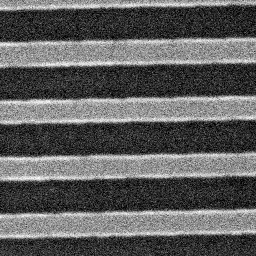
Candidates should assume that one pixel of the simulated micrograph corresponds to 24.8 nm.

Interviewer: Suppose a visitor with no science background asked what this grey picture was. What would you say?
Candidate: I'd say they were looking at lines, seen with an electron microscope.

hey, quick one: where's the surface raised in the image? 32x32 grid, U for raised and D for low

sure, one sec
UUUUUUUUUUUUUUUUUUUUUUUUUUUUUDDD
DDDDDDDDDDDDDDDDDDDDDDDDDDDDDDDD
DDDDDDDDDDDDDDDDDDDDDDDDDDDDDDDD
DDDDDDDDDDDDDDDDDDDDDDDDDDDDDDDD
DDDDDDDDDDDDDDDDDDDDDDDDDDDDDDDD
UUUUUUUUUUUUUUUUUUUUUUUUUUUUUUUU
UUUUUUUUUUUUUUUUUUUUUUUUUUUUUUUU
UUUUUUUUUUUUUUUUUUUUUUUUUUUUUUUU
DDDDDDDDDDDDDDDDDDDDDDDDDDDDDDDD
DDDDDDDDDDDDDDDDDDDDDDDDDDDDDDDD
DDDDDDDDDDDDDDDDDDDDDDDDDDDDDDDD
DDDDDDDDDDDDDDDDDDDDDDDDDDDDDDDD
DDDDDDDDDDDDDDDUUUUUUUUUUUUUUUUU
UUUUUUUUUUUUUUUUUUUUUUUUUUUUUUUU
UUUUUUUUUUUUUUUUUUUUUUUUUUUUUUUU
DDDDDDDDDDDDDDDDDDDDDDDDDDDDDDDD
DDDDDDDDDDDDDDDDDDDDDDDDDDDDDDDD
DDDDDDDDDDDDDDDDDDDDDDDDDDDDDDDD
DDDDDDDDDDDDDDDDDDDDDDDDDDDDDDDD
DDDDDDDDDDDDDDDDDDUUUUUUUUUUUUUU
UUUUUUUUUUUUUUUUUUUUUUUUUUUUUUUU
UUUUUUUUUUUUUUUUUUUUUUUUUUUUUUUU
DDDDDDDDDDDDDDDDDDDDDDDDDDDDDDDD
DDDDDDDDDDDDDDDDDDDDDDDDDDDDDDDD
DDDDDDDDDDDDDDDDDDDDDDDDDDDDDDDD
DDDDDDDDDDDDDDDDDDDDDDDDDDDDDDDD
DDDDDDDDDDDDDDDDDDDDDDDDUUUUUUUU
UUUUUUUUUUUUUUUUUUUUUUUUUUUUUUUU
UUUUUUUUUUUUUUUUUUUUUUUUUUUUUUUU
UUUUUUDDDDDDDDDDDDDDDDDDDDDDDDDD
DDDDDDDDDDDDDDDDDDDDDDDDDDDDDDDD
DDDDDDDDDDDDDDDDDDDDDDDDDDDDDDDD